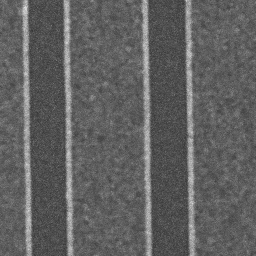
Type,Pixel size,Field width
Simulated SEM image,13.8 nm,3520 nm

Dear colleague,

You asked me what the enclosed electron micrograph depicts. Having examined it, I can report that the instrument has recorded one or a few lines or trenches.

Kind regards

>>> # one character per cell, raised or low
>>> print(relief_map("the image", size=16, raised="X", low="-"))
XX--XXXXX---XXXX
XX--XXXXX---XXXX
XX--XXXXX---XXXX
XX--XXXXX---XXXX
XX--XXXXX---XXXX
XX--XXXXX---XXXX
XX--XXXXX---XXXX
XX--XXXXX---XXXX
XX--XXXXX---XXXX
XX--XXXXX---XXXX
XX--XXXXX---XXXX
XX--XXXXX---XXXX
XX--XXXXX---XXXX
XX--XXXXX---XXXX
XX--XXXXX---XXXX
XX--XXXXX---XXXX